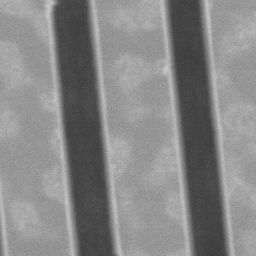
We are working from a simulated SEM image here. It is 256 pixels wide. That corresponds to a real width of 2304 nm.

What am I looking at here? one or a few lines or trenches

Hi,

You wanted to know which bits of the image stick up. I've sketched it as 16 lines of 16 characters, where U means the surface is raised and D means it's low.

UUUDDDUUUUDDDUUU
UUUDDDUUUUDDDUUU
UUUDDDUUUUUDDUUU
UUUDDDUUUUUDDUUU
UUUUDDUUUUUDDUUU
UUUUDDUUUUUDDUUU
UUUUDDUUUUUDDUUU
UUUUDDUUUUUDDUUU
UUUUDDDUUUUDDDUU
UUUUDDDUUUUDDDUU
UUUUDDDUUUUDDDUU
UUUUDDDUUUUUDDUU
UUUUDDDUUUUUDDUU
UUUUDDDUUUUUDDUU
UUUUUDDUUUUUDDUU
UUUUUDDUUUUUDDUU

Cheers